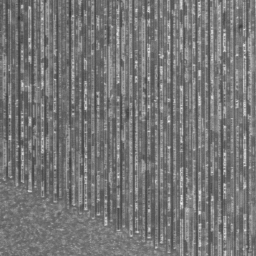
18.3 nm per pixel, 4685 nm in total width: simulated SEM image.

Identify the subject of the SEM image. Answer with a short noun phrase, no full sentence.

parallel lines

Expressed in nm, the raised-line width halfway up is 36.6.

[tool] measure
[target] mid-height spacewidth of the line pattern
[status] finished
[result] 70.9 nm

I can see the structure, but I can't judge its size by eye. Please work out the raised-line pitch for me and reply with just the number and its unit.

0.115 µm